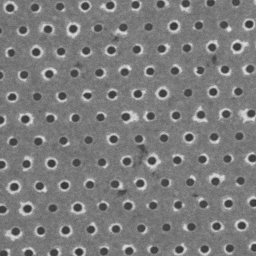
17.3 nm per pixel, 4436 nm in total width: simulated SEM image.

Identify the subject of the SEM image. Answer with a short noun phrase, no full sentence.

a regular array of holes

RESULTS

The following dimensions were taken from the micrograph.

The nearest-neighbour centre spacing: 24.9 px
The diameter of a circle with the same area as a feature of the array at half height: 149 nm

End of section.